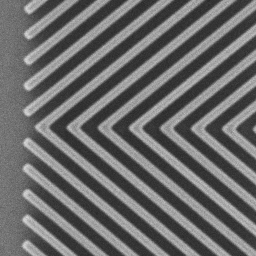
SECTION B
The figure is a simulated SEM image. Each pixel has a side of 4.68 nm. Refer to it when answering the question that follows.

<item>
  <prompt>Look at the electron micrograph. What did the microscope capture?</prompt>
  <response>groups of lines, slits or small figures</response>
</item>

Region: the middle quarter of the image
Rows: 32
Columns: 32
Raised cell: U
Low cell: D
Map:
DDDDUUUDDDDUUUUDDDDUUUUDDDDUUUUD
DDUUUUDDDDUUUDDDDDUUUDDDDDUUUDDD
DUUUDDDDDUUUDDDDDUUUDDDDDUUUDDDD
UUUDDDDDUUUDDDDUUUUDDDDUUUUDDDDU
UUDDDDDUUUDDDDUUUUDDDDUUUUDDDDUU
UDDDDUUUUDDDDUUUDDDDDUUUDDDDDUUU
DDDDUUUDDDDDUUUDDDDDUUUDDDDDUUUD
DDDUUUDDDDDUUUDDDDDUUUDDDDUUUUDD
DUUUUDDDDUUUUDDDDUUUDDDDDUUUDDDD
UUUUDDDDUUUDDDDDUUUDDDDDUUUDDDDD
UUDDDDDUUUDDDDDUUUDDDDDUUUDDDDUU
UDDDDDUUUDDDDDUUUDDDDDUUUDDDDUUU
DDDDUUUUDDDDUUUUDDDDUUUDDDDDUUUD
DDDUUUDDDDDUUUDDDDDUUUDDDDDUUUDD
DDUUUDDDDDUUUDDDDDUUUDDDDDUUUDDD
DUUUDDDDDUUUDDDDDUUUDDDDUUUUDDDD
DUUUDDDDDUUUDDDDUUUUDDDDUUUDDDDD
DDUUUUDDDDUUUDDDDDUUUDDDDUUUUDDD
DDDUUUUDDDDUUUDDDDDUUUDDDDUUUUDD
DDDDDUUUDDDDUUUUDDDDUUUDDDDDUUUD
UDDDDDUUUDDDDUUUUDDDDUUUDDDDDUUU
UUUDDDDUUUDDDDDUUUDDDDUUUUDDDDUU
UUUUDDDDUUUDDDDDUUUDDDDDUUUDDDDU
DDUUUDDDDUUUUDDDDUUUDDDDDUUUDDDD
DDDUUUDDDDDUUUDDDDUUUUDDDDUUUDDD
DDDDUUUDDDDDUUUDDDDUUUUDDDDUUUDD
UDDDDUUUUDDDDUUUDDDDDUUUDDDDUUUU
UUDDDDUUUUDDDDUUUDDDDDUUUDDDDUUU
UUUDDDDDUUUDDDDUUUUDDDDUUUDDDDDU
DUUUDDDDDUUUDDDDUUUUDDDDUUUDDDDD
DDUUUUDDDDUUUDDDDDUUUDDDDUUUUDDD
DDDDUUUDDDDUUUDDDDDUUUDDDDDUUUDD